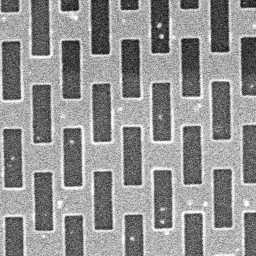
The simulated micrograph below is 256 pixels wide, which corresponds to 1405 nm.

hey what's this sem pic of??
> groups of lines, slits or small figures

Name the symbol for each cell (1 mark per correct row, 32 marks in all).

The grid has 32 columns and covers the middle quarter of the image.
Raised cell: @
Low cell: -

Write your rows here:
----@@@@@@@@@@-----@@@@@@@@@@---
----@@@@@@@@@@-----@@@@@@@@@@---
----@@@@@@@@@@-----@@@@@@@@@@---
----@@@@@@@@@@-----@@@@@@@@@@---
----@@@@@@@@@@-----@@@@---@@@---
----@@@-----@@-----@@@-----@@---
----@@@-----@@------@@-----@@---
----@@@-----@@------@@-----@@---
----@@@-----@@@----@@@-----@@@--
@@@@@@@-----@@@@@@@@@@-----@@@@@
@@@@@@@-----@@@@@@@@@@-----@@@@@
@@@@@@@-----@@@@@@@@@@-----@@@@@
@@@@@@@-----@@@@@@@@@@-----@@@@@
@@@@@@@-----@@@@@@@@@@-----@@@@@
@@@@@@@-----@@@@@@@@@@-----@@@@@
@@@@@@@-----@@@----@@@-----@@@--
-----@@-----@@------@@-----@@---
-----@@-----@@------@@-----@@---
-----@@-----@@------@@-----@@---
-----@@-----@@------@@-----@@---
-----@@@@@@@@@------@@@@@@@@@---
-----@@@@@@@@@------@@@@@@@@@---
-----@@@@@@@@@------@@@@@@@@@---
-----@@@@@@@@@@-----@@@@@@@@@---
-----@@@@@@@@@@-----@@@@@@@@@---
-----@@@@@@@@@@-----@@@@@@@@@---
-----@@@@@@@@@@-----@@-----@@@--
-----@@-----@@@-----@@-----@@@--
-----@@-----@@@-----@@-----@@@--
-----@@-----@@@-----@@-----@@@--
-----@@-----@@@----@@@-----@@@@@
@@@@@@@-----@@@@@@@@@@-----@@@@@